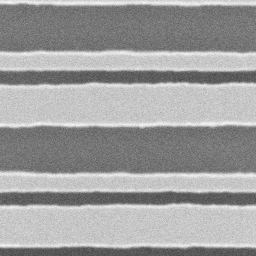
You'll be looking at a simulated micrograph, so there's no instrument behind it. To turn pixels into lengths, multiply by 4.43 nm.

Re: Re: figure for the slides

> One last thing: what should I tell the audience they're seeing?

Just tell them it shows lines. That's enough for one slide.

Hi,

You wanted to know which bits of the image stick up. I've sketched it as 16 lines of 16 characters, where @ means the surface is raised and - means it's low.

----------------
----------------
----------------
@@@@@@@@@@@@@@@@
@@@@@@@@@@@@@@@@
@@@@@@@@@@@@@@@@
@@@@@@@@@@@@@@@@
@@@@@@@@@@@@@@@@
----------------
----------------
----------------
@@@@@@@@@@@@@@@@
@@@@@@@@@@@@@@@@
@@@@@@@@@@@@@@@@
@@@@@@@@@@@@@@@@
----------------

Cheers